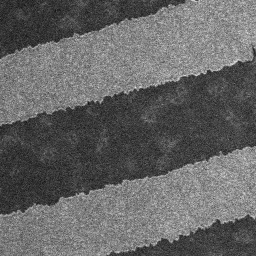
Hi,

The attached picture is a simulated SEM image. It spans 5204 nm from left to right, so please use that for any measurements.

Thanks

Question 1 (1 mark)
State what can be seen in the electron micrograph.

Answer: one or a few lines or trenches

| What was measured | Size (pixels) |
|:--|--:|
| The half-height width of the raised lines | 66.1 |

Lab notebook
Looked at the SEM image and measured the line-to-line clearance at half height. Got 1770 nm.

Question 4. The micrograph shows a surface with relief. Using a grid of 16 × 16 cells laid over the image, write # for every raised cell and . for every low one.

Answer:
..........######
.......#########
....############
################
#############...
#########.......
#####...........
#...............
................
...............#
...........#####
.......#########
....############
################
############....
########........